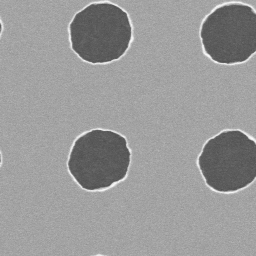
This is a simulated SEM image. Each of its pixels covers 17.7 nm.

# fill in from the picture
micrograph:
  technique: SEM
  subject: holes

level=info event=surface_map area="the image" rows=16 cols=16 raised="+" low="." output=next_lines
+++++..+++++++..
++++....+++++...
++++....+++++...
+++++..++++++...
++++++++++++++++
++++++++++++++++
++++++++++++++++
++++++++++++++++
+++++..++++++..+
++++....+++++...
++++....+++++...
+++++..++++++...
++++++++++++++++
++++++++++++++++
++++++++++++++++
++++++++++++++++